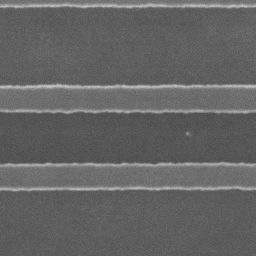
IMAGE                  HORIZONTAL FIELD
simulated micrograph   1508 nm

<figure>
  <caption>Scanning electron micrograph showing lines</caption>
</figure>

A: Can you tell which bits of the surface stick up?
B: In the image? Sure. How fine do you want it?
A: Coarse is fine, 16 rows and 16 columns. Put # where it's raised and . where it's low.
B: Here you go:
................
................
................
................
................
################
################
................
................
................
################
################
................
................
................
................